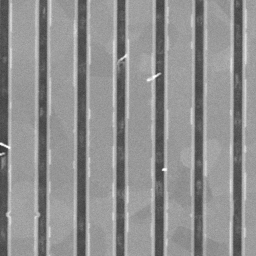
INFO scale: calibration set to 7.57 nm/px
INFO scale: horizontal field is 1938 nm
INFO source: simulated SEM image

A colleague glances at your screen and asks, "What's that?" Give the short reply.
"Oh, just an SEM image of parallel lines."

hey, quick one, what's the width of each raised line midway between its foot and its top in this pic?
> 204 nanometers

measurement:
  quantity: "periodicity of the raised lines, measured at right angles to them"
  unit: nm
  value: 296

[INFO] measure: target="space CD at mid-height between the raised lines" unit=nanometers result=88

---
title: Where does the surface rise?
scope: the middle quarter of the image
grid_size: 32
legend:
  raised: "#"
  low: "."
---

###...#######...######....######
###...#######...######....######
###...#######...#######...######
###...#######...#######...######
###...#######...######....######
###...#######...#######...######
###...#######...#######...######
###...#######...#######...######
###...#######...#######...######
###...#######...######....######
###...#######...######....######
###...#######...######....######
###...#######...######....######
###...#######...######....######
###...#######...######....######
###...#######...######....######
###...#######...######....######
###...#######...######....######
###...#######...######....######
###...#######...######....######
###...#######...######....######
###...#######...######....######
###...#######...######....######
###...#######...######....######
###...#######...######....######
###...#######...######....######
###...#######...######...#######
###...#######...######....######
###...#######...######....######
###...#######...######....######
###...#######...######....######
###...#######...######....######